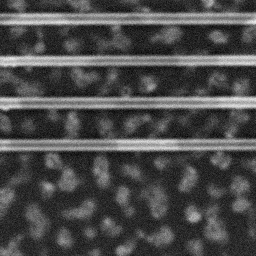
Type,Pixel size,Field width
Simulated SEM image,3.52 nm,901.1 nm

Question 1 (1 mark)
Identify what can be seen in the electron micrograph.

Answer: parallel lines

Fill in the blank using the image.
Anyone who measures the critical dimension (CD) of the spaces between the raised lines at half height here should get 119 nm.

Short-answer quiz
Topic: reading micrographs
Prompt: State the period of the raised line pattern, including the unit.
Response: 0.148 micrometres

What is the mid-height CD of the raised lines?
29 nanometres